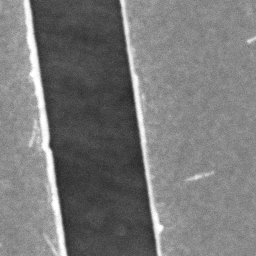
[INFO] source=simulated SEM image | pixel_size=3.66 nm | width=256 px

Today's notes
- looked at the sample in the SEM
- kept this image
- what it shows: one or a few lines or trenches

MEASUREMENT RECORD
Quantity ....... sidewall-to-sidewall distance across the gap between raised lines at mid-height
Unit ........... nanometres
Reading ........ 340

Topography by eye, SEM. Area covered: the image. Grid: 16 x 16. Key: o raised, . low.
oo......oooooooo
oo......oooooooo
oo......oooooooo
oo......oooooooo
oo......oooooooo
ooo.....oooooooo
ooo......ooooooo
ooo......ooooooo
ooo......ooooooo
ooo......ooooooo
ooo......ooooooo
ooo......ooooooo
oooo.....ooooooo
oooo......oooooo
oooo......oooooo
oooo......oooooo